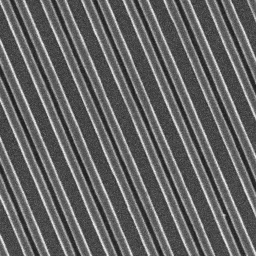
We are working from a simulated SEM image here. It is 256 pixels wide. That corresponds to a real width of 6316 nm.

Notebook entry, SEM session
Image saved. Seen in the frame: parallel lines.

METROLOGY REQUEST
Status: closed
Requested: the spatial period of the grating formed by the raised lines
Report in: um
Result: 0.465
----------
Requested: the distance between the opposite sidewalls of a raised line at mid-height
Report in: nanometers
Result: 213